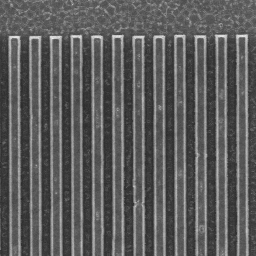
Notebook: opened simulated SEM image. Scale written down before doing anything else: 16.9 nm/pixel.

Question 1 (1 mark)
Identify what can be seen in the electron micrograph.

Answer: parallel lines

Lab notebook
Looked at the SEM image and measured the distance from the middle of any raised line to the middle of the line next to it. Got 20.7 px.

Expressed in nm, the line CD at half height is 175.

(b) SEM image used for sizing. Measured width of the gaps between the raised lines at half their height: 177 nm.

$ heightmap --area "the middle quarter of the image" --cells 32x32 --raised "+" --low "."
..++...++...+++..+++...++...++..
..++...++...+++..+++...++...++..
..++...+++..+++..+++...++...++..
..++...+++..+++..+++...++...++..
..++...+++..+++..+++...++...++..
..++...+++..+++..+++...++...++..
..++...+++..+++..+++...++...++..
..++...+++..+++..+++...++...++..
..++...+++..+++..+++...++...++..
..++...+++..+++..+++...++...++..
..++...++...+++..+++...++...++..
..++...++...+++..+++...++...++..
..++...+++..+++..+++...++...++..
..++...+++..+++..+++...++...++..
..++...+++..+++..+++...++...++..
..++...++...+++..+++...++...++..
..++...++...+++..+++...++...++..
..++...+++..+++..+++...++...++..
..++...+++..+++..+++...++...++..
..++...++...+++..+++...++...++..
..++...++...+++..+++...++...++..
..++...++...+++..+++...++...++..
..++...+++..+++..+++...++...++..
..++...+++...++..+++...++...++..
..++...+++...++..+++...++...++..
..++...+++...++..+++...++...++..
..++...++....++..+++...++...++..
..++...+++...++..+++...++...++..
..++...++....++..+++...++...++..
..++...++....++..+++...++...++..
..++...++....++..+++...++...++..
..++...++....++...++...++...++..